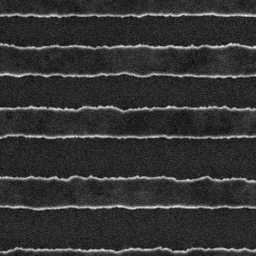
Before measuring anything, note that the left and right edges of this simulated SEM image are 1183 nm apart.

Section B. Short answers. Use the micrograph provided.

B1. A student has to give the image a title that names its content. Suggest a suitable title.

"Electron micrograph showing lines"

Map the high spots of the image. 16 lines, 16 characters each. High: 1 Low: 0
1111111111111111
0000000000000000
0000000000000000
1111111111111111
1111111111111111
0000000000000000
0000000000000000
1111111111111111
1111111111111111
0000000000000000
0000000000000000
1111111111111111
1111111111111111
0000000000000000
0000000000000000
0000000000000000